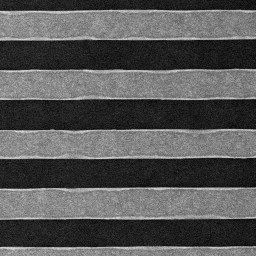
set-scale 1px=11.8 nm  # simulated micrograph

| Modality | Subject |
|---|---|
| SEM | wiring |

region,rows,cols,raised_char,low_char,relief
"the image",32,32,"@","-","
--------------------------------
-----------@@@@@--@@@@-@@@@@@@@-
@@@@@@@@@@@@@@@@@@@@@@@@@@@@@@@@
@@@@@@@@@@@@@@@@@@@@@@@@@@@@@@@@
@@@@@@@@@@@@@@@@@@@@@@@@@@@@@@@@
--------------------------------
--------------------------------
--------------------------------
--------------------------------
@@@@@@@@@@@@@@@@@@@@@@@@@@@@@@@@
@@@@@@@@@@@@@@@@@@@@@@@@@@@@@@@@
@@@@@@@@@@@@@@@@@@@@@@@@@@@@@@@@
--------------------------------
--------------------------------
--------------------------------
--------------------------------
@@@@@@@@@-@@@@@@@@@@@@@@@@@@@@@@
@@@@@@@@@@@@@@@@@@@@@@@@@@@@@@@@
@@@@@@@@@@@@@@@@@@@@@@@@@@@@@@@@
@@@@@@@@@@@@@@@@@@@@@@@@@@@@@@@@
--------------------------------
--------------------------------
--------------------------------
--------------------------------
@@@@@@@@@@@@@@@@@@@@@@@@@@@@@@@@
@@@@@@@@@@@@@@@@@@@@@@@@@@@@@@@@
@@@@@@@@@@@@@@@@@@@@@@@@@@@@@@@@
--------------------------------
--------------------------------
--------------------------------
--------------------------------
@@@@@@@@@@@@@@@@@@@@@@@@@@@@@@@@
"